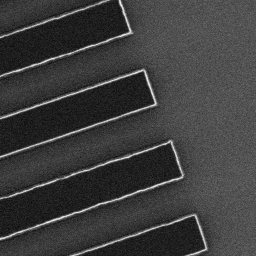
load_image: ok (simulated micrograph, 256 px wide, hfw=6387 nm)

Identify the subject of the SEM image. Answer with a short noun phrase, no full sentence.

one or a few lines or trenches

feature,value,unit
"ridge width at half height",919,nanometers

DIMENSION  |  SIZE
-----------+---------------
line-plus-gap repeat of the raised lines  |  1.89 microns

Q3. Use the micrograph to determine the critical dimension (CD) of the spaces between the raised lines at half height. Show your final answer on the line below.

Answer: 990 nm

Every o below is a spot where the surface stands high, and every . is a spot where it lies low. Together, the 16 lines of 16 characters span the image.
.....ooo........
..oooooo........
ooooooo.........
oooo............
o...............
......ooo.......
...oooooo.......
ooooooo.........
oooo............
o........oo.....
......ooooo.....
...ooooooo......
ooooooo.........
oooo............
o........oooo...
......ooooooo...